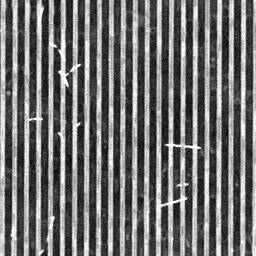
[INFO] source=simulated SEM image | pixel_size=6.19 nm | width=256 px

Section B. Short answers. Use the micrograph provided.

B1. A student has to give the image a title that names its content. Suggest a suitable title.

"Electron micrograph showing parallel lines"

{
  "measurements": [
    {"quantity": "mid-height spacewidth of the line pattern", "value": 8.5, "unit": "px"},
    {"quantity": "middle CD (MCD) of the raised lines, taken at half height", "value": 20.1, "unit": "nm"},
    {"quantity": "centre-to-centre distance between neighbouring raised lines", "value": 74.3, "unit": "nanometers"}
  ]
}